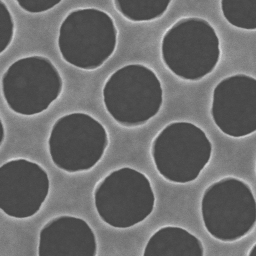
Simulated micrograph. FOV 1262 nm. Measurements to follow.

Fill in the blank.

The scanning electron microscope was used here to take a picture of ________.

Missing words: holes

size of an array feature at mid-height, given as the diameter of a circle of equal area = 287 nm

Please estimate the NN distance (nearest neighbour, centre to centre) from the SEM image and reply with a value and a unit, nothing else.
361 nanometers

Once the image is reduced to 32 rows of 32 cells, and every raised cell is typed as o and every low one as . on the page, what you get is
.o.....oooooooo......ooooooo....
.ooo.oooo....oo.....oooooooo....
.ooooooo......ooo..oooo..ooo....
..oooooo......ooooooo.....oooo..
..ooooo.......ooooooo......ooooo
.oooooo.......oooooo.......ooooo
oooooooo......oooooo.......ooooo
oo....oo.....oooooooo......ooooo
o......ooo..ooo...ooo......ooooo
.......ooooooo.....oooo..ooooo.o
........ooooo.......ooooooo.....
o......oooooo.......ooooooo.....
o......oooooo.......ooooooo.....
o.....ooooooo.......ooooooo.....
oooooooo...ooo.....oooooooo.....
ooooooo.....oooo.ooooo..ooo.....
oooooo.......ooooooo.....ooo....
oooooo.......ooooooo......oooooo
oooooo.......oooooo.......oooooo
oooooo.......oooooo.......oooooo
o...ooo.....ooooooo.......oooooo
......oooooooo...ooo.....ooooooo
......ooooooo.....ooo...oooo..oo
......oooooo.......ooooooo.....o
......oooooo.......oooooo.......
.....ooooooo.......oooooo.......
o...oooooooo.......oooooo.......
ooooooo...ooo.....oooooooo......
oooooo.....ooooooooo..oooo.....o
ooooo.......ooooooo.....ooo...oo
ooooo.......oooooo.......ooooooo
ooooo.......oooooo.......oooooo.